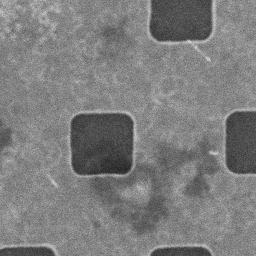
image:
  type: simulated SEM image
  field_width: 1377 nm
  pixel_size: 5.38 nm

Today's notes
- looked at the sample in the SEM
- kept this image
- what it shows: holes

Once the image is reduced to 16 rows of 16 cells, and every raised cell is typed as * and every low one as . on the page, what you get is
*********....***
*********....***
**********...***
****************
****************
****************
****************
*****...******..
****....******..
****....******..
*****...******..
****************
****************
****************
****************
...*******...***